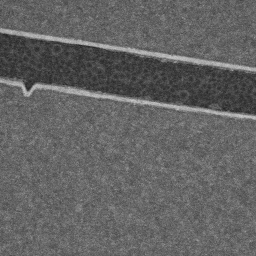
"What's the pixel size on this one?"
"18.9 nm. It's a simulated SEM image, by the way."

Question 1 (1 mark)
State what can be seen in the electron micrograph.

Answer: one or a few lines or trenches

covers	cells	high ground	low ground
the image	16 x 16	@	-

@@@@@@@@@@@@@@@@
@@@@@@@@@@@@@@@@
----@@@@@@@@@@@@
----------@@@@@@
----------------
@-@-------------
@@@@@@@@@@------
@@@@@@@@@@@@@@@@
@@@@@@@@@@@@@@@@
@@@@@@@@@@@@@@@@
@@@@@@@@@@@@@@@@
@@@@@@@@@@@@@@@@
@@@@@@@@@@@@@@@@
@@@@@@@@@@@@@@@@
@@@@@@@@@@@@@@@@
@@@@@@@@@@@@@@@@